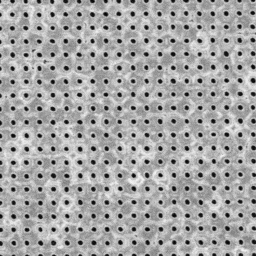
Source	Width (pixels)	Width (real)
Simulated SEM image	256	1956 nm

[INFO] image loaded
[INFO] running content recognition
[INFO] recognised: a regular array of holes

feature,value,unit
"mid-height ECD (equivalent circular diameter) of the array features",41.4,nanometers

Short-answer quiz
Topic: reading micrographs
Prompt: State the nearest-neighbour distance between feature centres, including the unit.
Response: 99.4 nanometres